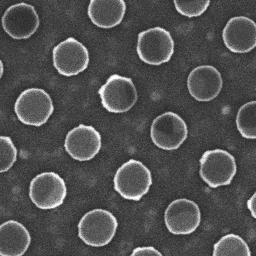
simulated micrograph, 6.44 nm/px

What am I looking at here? a regular array of raised bodies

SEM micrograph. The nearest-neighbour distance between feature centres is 0.387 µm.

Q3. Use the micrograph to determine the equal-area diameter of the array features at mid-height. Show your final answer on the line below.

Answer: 236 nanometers